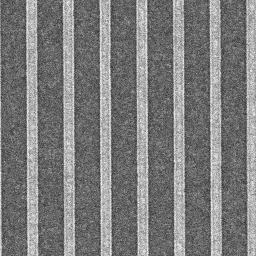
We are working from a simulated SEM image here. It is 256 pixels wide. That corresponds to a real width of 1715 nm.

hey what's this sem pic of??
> parallel lines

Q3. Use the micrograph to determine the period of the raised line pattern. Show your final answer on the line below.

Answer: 36.7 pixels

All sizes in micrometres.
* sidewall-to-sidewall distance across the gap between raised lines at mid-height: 0.184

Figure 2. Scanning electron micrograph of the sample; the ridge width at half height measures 61.1 nm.